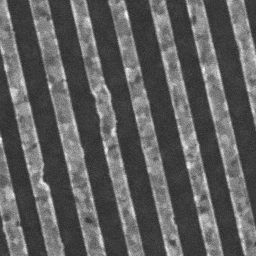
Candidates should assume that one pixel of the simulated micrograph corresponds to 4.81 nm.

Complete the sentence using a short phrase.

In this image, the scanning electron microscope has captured parallel lines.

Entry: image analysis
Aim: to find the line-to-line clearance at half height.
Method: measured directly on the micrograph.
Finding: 112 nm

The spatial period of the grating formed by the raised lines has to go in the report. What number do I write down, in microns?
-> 0.185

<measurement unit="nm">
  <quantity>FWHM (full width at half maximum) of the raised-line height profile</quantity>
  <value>74.5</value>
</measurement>